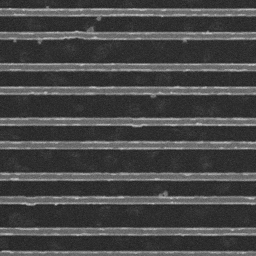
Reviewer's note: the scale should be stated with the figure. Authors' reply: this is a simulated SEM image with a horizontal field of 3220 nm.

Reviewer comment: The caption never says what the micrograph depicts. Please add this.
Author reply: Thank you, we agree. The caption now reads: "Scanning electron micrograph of parallel lines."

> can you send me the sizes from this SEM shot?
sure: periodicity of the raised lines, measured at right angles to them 345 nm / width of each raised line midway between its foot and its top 7.25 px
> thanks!